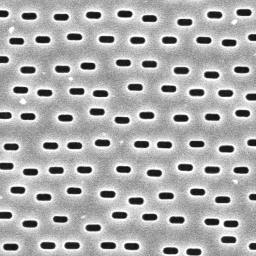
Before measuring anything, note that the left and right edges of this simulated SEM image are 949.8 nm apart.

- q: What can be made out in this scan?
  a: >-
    a regular array of holes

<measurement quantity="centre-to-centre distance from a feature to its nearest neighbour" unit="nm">91.7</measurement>